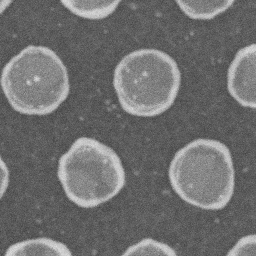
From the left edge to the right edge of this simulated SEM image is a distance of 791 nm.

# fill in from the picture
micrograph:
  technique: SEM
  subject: raised bodies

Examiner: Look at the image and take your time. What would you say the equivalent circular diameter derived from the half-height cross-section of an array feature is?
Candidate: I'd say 195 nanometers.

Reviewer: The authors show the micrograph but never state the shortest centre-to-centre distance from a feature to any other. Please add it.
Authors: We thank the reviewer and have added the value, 333 nanometers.